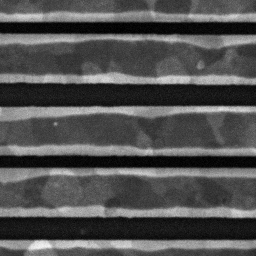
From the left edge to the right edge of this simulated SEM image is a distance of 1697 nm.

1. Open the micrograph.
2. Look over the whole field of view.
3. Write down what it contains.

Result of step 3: lines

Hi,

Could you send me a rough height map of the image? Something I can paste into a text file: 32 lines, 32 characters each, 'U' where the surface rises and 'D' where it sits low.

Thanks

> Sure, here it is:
UUUUUUUUUUUUUUUUUUUUUUUUUUUUUUUU
UUUUUUUUUUUUUUUUUUUUUUUUUUUUUUUU
DDDDDDDDDDDDDDDDDDDDDDDDDDDDDDDD
DDDDDDDDDDDDDDDDDDDDDDDDDDDDDDDD
DDDDDDDDDDDDDDDDDDDDDDDDDDDDDDDD
UUUUUUUUUUUUUUUUUUUUUUUUUUUUUUUU
UUUUUUUUUUUUUUUUUUUUUUUUUUUUUUUU
UUUUUUUUUUUUUUUUUUUUUUUUUUUUUUUU
UUUUUUUUUUUUUUUUUUUUUUUUUUUUUUUU
UUUUUUUUUUUUUUUUUUUUUUUUUUUUUUUU
DDDDDDDDDDDDDDDDDDDDDDDDDDDDDDDD
DDDDDDDDDDDDDDDDDDDDDDDDDDDDDDDD
DDDDDDDDDDDDDDDDDDDDDDDDDDDDDDDD
DDDDDDDDDDDDDDDDDDDDDDDDDDDDDDDD
UUUUUUUUUUUUUUUUUUUUUUUUUUUUUUUU
UUUUUUUUUUUUUUUUUUUUUUUUUUUUUUUU
UUUUUUUUUUUUUUUUUUUUUUUUUUUUUUUU
UUUUUUUUUUUUUUUUUUUUUUUUUUUUUUUU
UUUUUUUUUUUUUUUUUUUUUUUUUUUUUUUU
DDDDDDDDDDDDDDDDDDDDDDDDDDDDDDDD
DDDDDDDDDDDDDDDDDDDDDDDDDDDDDDDD
DDDDUUUUUUUUUUUUUUUUUUUUUUDUUDDD
UUUUUUUUUUUUUUUUUUUUUUUUUUUUUUUU
UUUUUUUUUUUUUUUUUUUUUUUUUUUUUUUU
UUUUUUUUUUUUUUUUUUUUUUUUUUUUUUUU
UUUUUUUUUUUUUUUUUUUUUUUUUUUUUUUU
UUUUUUUUUUUUUUUUUUUUUUUUUUUUUUUU
DDDDDDDDDDDDDDDDDDDDDDDDDDDDDDDD
DDDDDDDDDDDDDDDDDDDDDDDDDDDDDDDD
DDDDDDDDDDDDDDDDDDDDDDDDDDDDDDDD
UDDDDDDDDUUDDDDDDDDDDDDDDDDDDDDD
UUUUUUUUUUUUUUUUUUUUUUUUUUUUUUUU